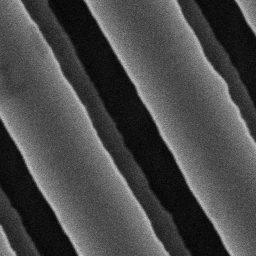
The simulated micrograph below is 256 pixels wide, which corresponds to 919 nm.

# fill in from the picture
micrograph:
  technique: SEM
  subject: lines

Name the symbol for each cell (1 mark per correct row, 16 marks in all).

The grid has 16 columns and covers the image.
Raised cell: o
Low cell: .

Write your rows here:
ooo...oooooo...o
ooo...ooooooo...
ooo....oooooo...
oooo...ooooooo..
oooo....ooooooo.
ooooo...ooooooo.
ooooo....oooooo.
oooooo....ooooo.
.ooooo....oooooo
.oooooo....ooooo
..ooooooo..ooooo
..ooooooo...oooo
...oooooo...oooo
o...ooooooo..ooo
....ooooooo...oo
o....oooooo...oo